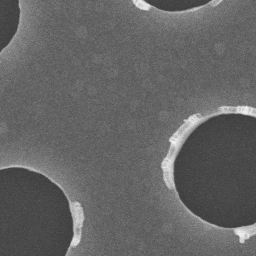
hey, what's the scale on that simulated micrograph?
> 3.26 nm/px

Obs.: holes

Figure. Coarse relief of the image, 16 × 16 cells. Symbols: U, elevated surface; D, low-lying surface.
DUUUUUUUUUDDUUUU
DUUUUUUUUUUUUUUU
DUUUUUUUUUUUUUUU
UUUUUUUUUUUUUUUU
UUUUUUUUUUUUUUUU
UUUUUUUUUUUUUUUU
UUUUUUUUUUUUUUUU
UUUUUUUUUUUUUDDD
UUUUUUUUUUUUDDDD
UUUUUUUUUUUDDDDD
UUUUUUUUUUUDDDDD
DDDUUUUUUUUDDDDD
DDDDUUUUUUUDDDDD
DDDDUUUUUUUUDDDD
DDDDDUUUUUUUUUUU
DDDDUUUUUUUUUUUU